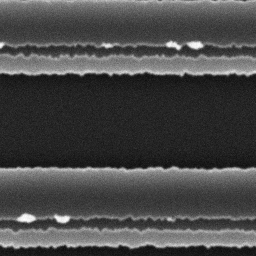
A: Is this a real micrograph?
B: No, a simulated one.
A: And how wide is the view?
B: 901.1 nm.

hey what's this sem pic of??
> lines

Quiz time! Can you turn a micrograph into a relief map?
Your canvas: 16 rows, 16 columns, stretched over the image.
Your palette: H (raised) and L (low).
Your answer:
HHHHHHHHHHHHHHHH
HHHHHHHHHHHHHHHH
HHHHHHHHHHHHHHHH
HHHHHHHHHHHHHHHH
HHHHHHHHHHHHHHHH
LLLLLLLLLLLLLLLL
LLLLLLLLLLLLLLLL
LLLLLLLLLLLLLLLL
LLLLLLLLLLLLLLLL
LLLLLLLLLLLLLLLL
LHHLLLLLLLLLLLLL
HHHHHHHHHHHHHHHH
HHHHHHHHHHHHHHHH
HHHHHHHHHHHHHHHH
HHHHHHHHHHHHHHHH
LLLLLLLLLLLLLLLL